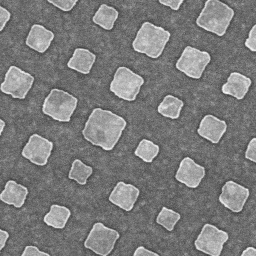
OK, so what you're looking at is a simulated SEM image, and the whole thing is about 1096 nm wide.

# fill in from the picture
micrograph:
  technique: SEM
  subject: a regular array of raised bodies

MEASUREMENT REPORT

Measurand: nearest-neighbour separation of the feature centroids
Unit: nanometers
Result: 207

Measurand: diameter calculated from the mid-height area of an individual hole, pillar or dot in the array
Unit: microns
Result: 0.11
